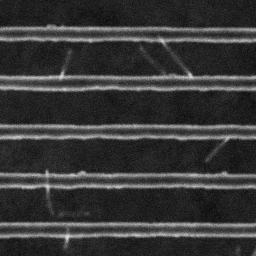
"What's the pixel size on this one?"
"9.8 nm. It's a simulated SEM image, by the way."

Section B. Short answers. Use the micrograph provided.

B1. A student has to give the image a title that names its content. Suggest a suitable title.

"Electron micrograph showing lines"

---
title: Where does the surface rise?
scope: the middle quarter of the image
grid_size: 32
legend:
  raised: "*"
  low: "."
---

................................
................................
................................
********************************
********************************
********************************
*****..................****.....
................................
................................
................................
................................
................................
................................
................................
................................
**.........***************.*..*.
********************************
********************************
..............****..........****
................................
................................
................................
................................
................................
................................
................................
................................
....*...........................
********************************
********************************
********************************
................................